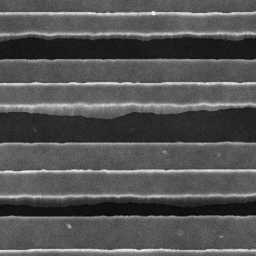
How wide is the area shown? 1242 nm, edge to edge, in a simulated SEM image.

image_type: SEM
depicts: lines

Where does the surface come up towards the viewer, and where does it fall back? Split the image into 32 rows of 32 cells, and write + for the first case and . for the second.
++++++++++++++++++++++++++++++++
++++++++++++++++++++++++++++++++
++++++++++++++++++++++++++++++++
++++++++++++++++++++++++++++++++
++....+....+.....++..........+..
................................
................................
++++++++++++++++++++++++++++++++
++++++++++++++++++++++++++++++++
++++++++++++++++++++++++++++++++
++++++++++++++++++++++++++++++++
++++++++++++++++++++++++++++++++
++++++++++++++++++++++++++++++++
...++.+++++++++.................
................................
................................
................................
................................
++++++++++++++++++++++++++++++++
++++++++++++++++++++++++++++++++
++++++++++++++++++++++++++++++++
++++++++++++++++++++++++++++++++
++++++++++++++++++++++++++++++++
++++++++++++++++++++++++++++++++
++++++++++++++++++++++++++++++++
................................
................................
++++++++++++++++++++++++++++++++
++++++++++++++++++++++++++++++++
++++++++++++++++++++++++++++++++
++++++++++++++++++++++++++++++++
++++++++++++++++++++++++++++++++